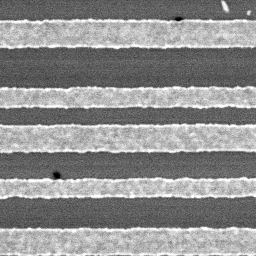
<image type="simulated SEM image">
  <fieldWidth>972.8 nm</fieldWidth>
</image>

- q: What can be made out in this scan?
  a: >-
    lines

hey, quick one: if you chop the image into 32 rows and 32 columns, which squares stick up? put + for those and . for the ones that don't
................................
................................
................................
++++++++++++++++++++++++++++++++
++++++++++++++++++++++++++++++++
++++++++++++++++++++++++++++++++
................................
................................
................................
................................
................................
++++++++++++++++++++++++++++++++
++++++++++++++++++++++++++++++++
................................
................................
................................
++++++++++++++++++++++++++++++++
++++++++++++++++++++++++++++++++
++++++++++++++++++++++++++++++++
................................
................................
................................
++++++++++++++++++++++++++++++++
++++++++++++++++++++++++++++++++
+++++++++++++++++++++++++++++++.
................................
................................
................................
.........................+......
++++++++++++++++++++++++++++++++
++++++++++++++++++++++++++++++++
++++++++++++++++++++++++++++++++